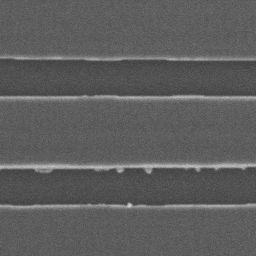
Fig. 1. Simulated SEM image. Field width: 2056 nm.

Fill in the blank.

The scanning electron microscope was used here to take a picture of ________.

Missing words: lines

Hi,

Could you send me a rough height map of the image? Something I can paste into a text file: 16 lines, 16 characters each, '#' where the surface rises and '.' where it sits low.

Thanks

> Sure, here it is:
################
################
################
################
................
................
################
################
################
################
....#...........
................
................
################
################
################